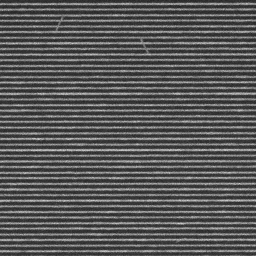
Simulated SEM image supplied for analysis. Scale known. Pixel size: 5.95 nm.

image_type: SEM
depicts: parallel lines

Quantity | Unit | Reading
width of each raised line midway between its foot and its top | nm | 8.9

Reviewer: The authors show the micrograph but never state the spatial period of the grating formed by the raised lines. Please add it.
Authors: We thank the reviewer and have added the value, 33.4 nm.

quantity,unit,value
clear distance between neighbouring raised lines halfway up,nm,26